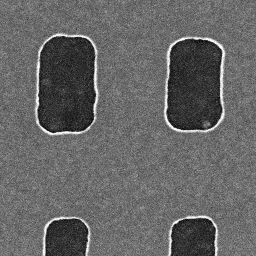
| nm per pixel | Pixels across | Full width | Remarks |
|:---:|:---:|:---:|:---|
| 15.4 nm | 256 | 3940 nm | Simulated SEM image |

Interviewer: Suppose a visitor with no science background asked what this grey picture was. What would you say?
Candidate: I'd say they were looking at holes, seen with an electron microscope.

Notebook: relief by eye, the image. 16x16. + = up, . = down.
++++++++++++++++
++++++++++++++++
+++...+++++..+++
++....+++++...++
++....+++++...++
++....++++....++
++....++++....++
++....++++....++
++++++++++++++++
++++++++++++++++
++++++++++++++++
++++++++++++++++
++++++++++++++++
++++++++++++++++
+++...+++++...++
+++..++++++...++